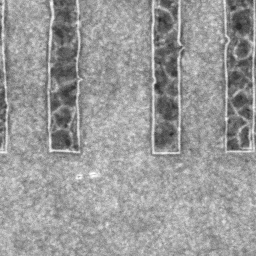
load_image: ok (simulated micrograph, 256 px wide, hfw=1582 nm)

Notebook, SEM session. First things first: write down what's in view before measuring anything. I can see one or a few lines or trenches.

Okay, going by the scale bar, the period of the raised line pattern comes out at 88.2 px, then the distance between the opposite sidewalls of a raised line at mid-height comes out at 172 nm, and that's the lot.